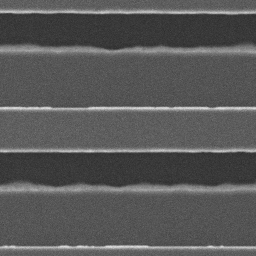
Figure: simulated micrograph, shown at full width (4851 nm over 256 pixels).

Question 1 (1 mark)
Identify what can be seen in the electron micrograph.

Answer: lines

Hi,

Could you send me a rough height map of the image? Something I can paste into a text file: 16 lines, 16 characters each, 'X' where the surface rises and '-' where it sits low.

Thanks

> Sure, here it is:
XXXXXXXXXXXXXXXX
----------------
----------------
XXXXXXXXXXXXXXXX
XXXXXXXXXXXXXXXX
XXXXXXXXXXXXXXXX
XXXXXXXXXXXXXXXX
XXXXXXXXXXXXXXXX
XXXXXXXXXXXXXXXX
----------------
----------------
----------------
XXXXXXXXXXXXXXXX
XXXXXXXXXXXXXXXX
XXXXXXXXXXXXXXXX
XXXXXXXXXXXXXXXX